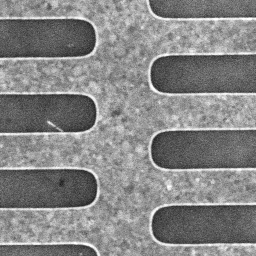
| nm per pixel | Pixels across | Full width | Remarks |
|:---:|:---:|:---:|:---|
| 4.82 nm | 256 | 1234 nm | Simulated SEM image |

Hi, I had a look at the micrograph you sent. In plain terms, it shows groups of lines, slits or small figures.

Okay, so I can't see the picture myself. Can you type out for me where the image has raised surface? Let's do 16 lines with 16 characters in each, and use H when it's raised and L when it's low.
HHHHHHHHHLLLLLLL
LLLLLLHHHHHHHHHH
LLLLLLHHHHHHHHHH
LLLLLHHHHHLLLLLL
HHHHHHHHHLLLLLLL
HHHHHHHHHHLLLLLL
LLLLLLHHHHHHHHHH
LLLLLLHHHHHHHHHH
HHHHHHHHHHLLLLLL
HHHHHHHHHLLLLLLL
HHHLHHHHHHLLLLLL
LLLLLLHHHHHHHHHH
LLLLLLHHHHHHHHHH
HHHHHHHHHHLLLLLL
HHHHHHHHHHLLLLLL
LLLLLLHHHHHHHHHH